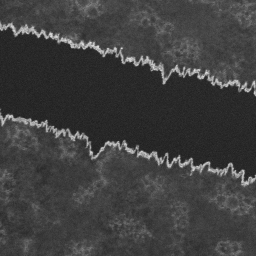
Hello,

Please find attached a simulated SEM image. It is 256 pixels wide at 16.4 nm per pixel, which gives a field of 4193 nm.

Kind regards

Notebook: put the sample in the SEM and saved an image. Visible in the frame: one or a few lines or trenches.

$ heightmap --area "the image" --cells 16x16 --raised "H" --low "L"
LLLLLLLLLLLLLLLL
LLLLLLLLLLLLLLLL
HHHHLLLLLLLLLLLL
HHHHHHHHLLLLLLLL
HHHHHHHHHHLHLLLL
HHHHHHHHHHHHHHHH
HHHHHHHHHHHHHHHH
LHHHHHHHHHHHHHHH
LLLLLHHHHHHHHHHH
LLLLLLLLHHHHHHHH
LLLLLLLLLLLLLHHH
LLLLLLLLLLLLLLLL
LLLLLLLLLLLLLLLL
LLLLLLLLLLLLLLLL
LLLLLLLLLLLLLLLL
LLLLLLLLLLLLLLLL